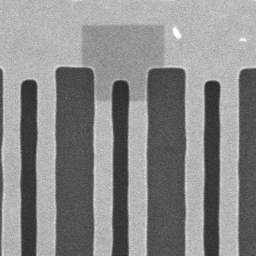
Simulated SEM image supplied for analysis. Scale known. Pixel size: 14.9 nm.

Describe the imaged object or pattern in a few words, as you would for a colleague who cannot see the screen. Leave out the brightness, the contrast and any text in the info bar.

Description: groups of lines, slits or small figures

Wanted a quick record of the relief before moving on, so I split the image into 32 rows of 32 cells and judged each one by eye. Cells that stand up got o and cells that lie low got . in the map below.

oooooooooooooooooooooooooooooooo
oooooooooooooooooooooooooooooooo
oooooooooooooooooooooooooooooooo
oooooooooooooooooooooooooooooooo
oooooooooooooooooooooooooooooooo
oooooooooooooooooooooooooooooooo
oooooooooooooooooooooooooooooooo
oooooooooooooooooooooooooooooooo
ooooooo....oooooooo....oooooooo.
ooooooo.....oooooo.....ooooooo..
ooo..oo.....oo..oo.....ooo.ooo..
oo...oo.....oo..oo.....oo...oo..
oo...oo.....oo..oo.....ooo.ooo..
oo...oo.....oo..oo.....ooo.ooo..
oo...oo.....oo..oo.....ooo.ooo..
oo...oo.....oo..oo.....oo...oo..
oo...oo.....oo..oo.....oo...oo..
oo...oo.....oo..oo.....oo...oo..
oo...oo.....oo..oo.....oo...oo..
ooo..oo.....oo..oo.....oo...oo..
ooo..oo.....oo..oo.....oo...oo..
ooo..oo.....oo..oo.....oo...oo..
oo...oo.....oo..oo.....oo..ooo..
oo...oo.....oo..oo.....oo..ooo..
ooo..oo.....oo..oo.....oo..ooo..
ooo..oo.....oo..oo.....oo..ooo..
oo...oo.....oo..oo.....oo..ooo..
oo...oo.....oo..oo.....oo..ooo..
ooo..oo.....oo..oo.....oo..ooo..
ooo..oo.....oo..oo.....oo..ooo..
ooo..oo.....oo..oo.....oo..ooo..
ooo..oo.....oo..oo.....oo..ooo..